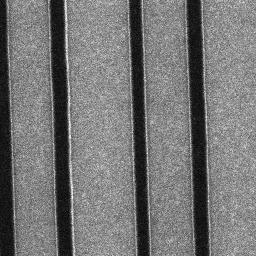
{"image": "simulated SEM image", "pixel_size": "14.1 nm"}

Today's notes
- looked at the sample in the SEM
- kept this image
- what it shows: one or a few lines or trenches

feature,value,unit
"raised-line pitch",964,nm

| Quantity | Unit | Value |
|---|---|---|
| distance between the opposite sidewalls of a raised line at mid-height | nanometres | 241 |